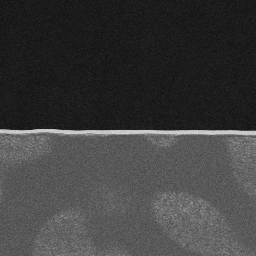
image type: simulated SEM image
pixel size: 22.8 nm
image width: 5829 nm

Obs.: wiring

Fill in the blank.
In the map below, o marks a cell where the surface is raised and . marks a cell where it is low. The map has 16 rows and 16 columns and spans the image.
................
................
................
................
................
................
................
................
oooooooooooooooo
oooooooooooooooo
oooooooooooooooo
oooooooooooooooo
oooooooooooooooo
oooooooooooooooo
oooooooooooooooo
oooooooooooooooo